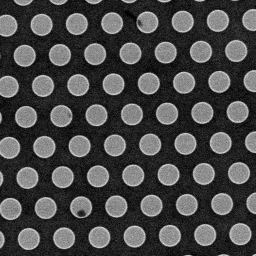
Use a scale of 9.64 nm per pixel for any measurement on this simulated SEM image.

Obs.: an array of small figures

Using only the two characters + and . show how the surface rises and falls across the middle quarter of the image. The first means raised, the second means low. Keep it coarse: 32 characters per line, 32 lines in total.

................................
................................
....................++.......+++
..+++.....+++++....++++.....++++
.+++++....+++++....+++++...+++++
.+++++....+++++....+++++...+++++
.+++++....+++++....++++.....++++
..+++......++...................
................................
................................
.......++......++++.....+++.....
++....++++.....++++....+++++....
++....+++++...+++++....+++++....
++....+++++....++++....+++++....
+.....++++.....++++.....+++.....
................................
................................
.............................++.
..++++.....++++....+++++....++++
.+++++....+++++....+++++....++++
.+++++....+++++....+++++....++++
..++++....+++++....+++++....++++
..++++.....+++......+++.......+.
................................
................................
................++.......+++....
++....+++++....+++++....++++....
++....+++++....+++++....+++++...
++....+++++....+++++....+++++...
++....+++++....++++.....++++....
+......+++......................
................................